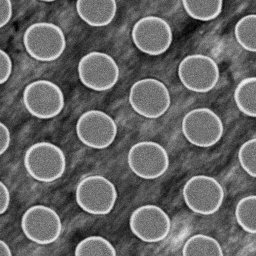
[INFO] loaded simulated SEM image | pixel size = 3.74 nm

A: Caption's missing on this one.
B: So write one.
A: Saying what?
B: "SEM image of a regular array of raised bodies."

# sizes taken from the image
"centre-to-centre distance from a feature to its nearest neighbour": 0.221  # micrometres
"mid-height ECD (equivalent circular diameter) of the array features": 0.144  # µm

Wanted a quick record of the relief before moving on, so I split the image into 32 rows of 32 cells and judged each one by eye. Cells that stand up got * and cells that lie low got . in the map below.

*.........****.........*****....
*.........****..........***.....
*..........***....**..........**
....***..........****........***
...*****.........****.........**
...*****.........****.........**
....****..........**............
*.........****.........***......
*.........*****.......*****.....
*.........*****.......*****.....
....***....***...***...****...**
...*****........*****.........**
...*****........*****.........**
...*****.........****.........**
.....**...***.....**...****.....
..........****.........*****....
*.........*****........*****....
*.........****..........***.....
*...***..........***..........**
...*****........*****.........**
...*****........*****.........**
....****.........***...........*
.....**...***...........***.....
*.........****.........*****....
*.........****.........*****....
*.........****.........*****..**
...****....**....***.....**...**
...****.........*****.........**
...*****........*****.........**
...****..........****...**......
*.........****.........****.....
*.........****.........*****....